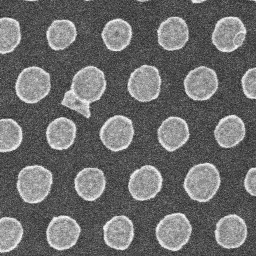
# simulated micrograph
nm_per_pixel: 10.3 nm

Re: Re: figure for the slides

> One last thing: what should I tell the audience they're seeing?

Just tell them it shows a regular array of raised bodies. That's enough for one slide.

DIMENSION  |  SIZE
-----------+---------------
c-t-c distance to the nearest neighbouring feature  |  571 nanometres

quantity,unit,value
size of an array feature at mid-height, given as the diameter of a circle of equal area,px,31.9